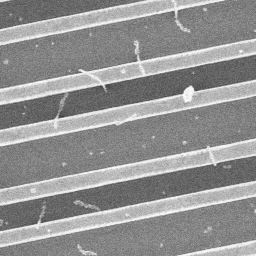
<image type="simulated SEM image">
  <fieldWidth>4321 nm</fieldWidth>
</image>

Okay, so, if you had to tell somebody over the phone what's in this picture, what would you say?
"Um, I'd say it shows lines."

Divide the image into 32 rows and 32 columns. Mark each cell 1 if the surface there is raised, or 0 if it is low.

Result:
00000000000000001111111111000000
00000000000111111111100000000000
00000011111111110000000000000000
01111111110000000000000000000000
11111100000000000000000000000000
10000000000000000000000000000111
00000000000000000000000011111111
00000000000000000011111111110000
00000000000001111111111000000000
00000000111111111100000000000000
00011111111111000000000000000111
11111111100000000000000111111111
11100000000000000001111111111000
00000000000000111111111100000000
00000000011111111110000000000000
00001111111111100000000000000000
11111111100000000000000000000000
11110000000000000000000000000001
00000000000000000000000000111111
00000000000000000000011111111111
00000000000000001111111111100000
00000000000111111111100000000000
00000011111111110000000000000000
01111111111000000000000000011111
11111100000000000000001111111111
10000000000000000011111111100000
00000000000011111111110000000000
00000001111111111000000000000000
00111111111100000000000000000000
11111110000000000000000000000000
11000000000000000000000000000111
00000000000000000000000011111111